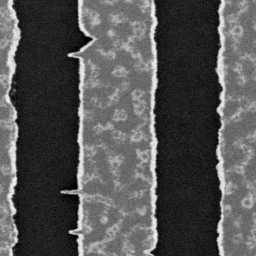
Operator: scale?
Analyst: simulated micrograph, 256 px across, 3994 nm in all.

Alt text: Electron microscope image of one or a few lines or trenches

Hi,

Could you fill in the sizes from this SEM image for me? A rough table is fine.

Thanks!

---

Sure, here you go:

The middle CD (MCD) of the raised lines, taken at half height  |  1150 nm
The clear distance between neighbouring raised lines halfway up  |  1.03 micrometres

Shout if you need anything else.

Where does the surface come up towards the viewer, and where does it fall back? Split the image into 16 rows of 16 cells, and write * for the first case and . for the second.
*....*****....**
*....*****....**
*.....****....**
*....*****....**
*....*****....**
*....*****....**
*....*****....**
*....*****....**
*....*****....**
*....*****....**
*....*****....**
*....*****....**
*....*****....**
*....*****....**
*....*****....**
*....*****....**